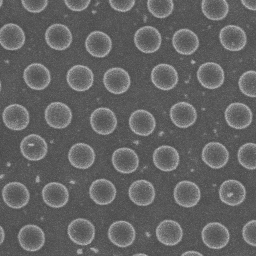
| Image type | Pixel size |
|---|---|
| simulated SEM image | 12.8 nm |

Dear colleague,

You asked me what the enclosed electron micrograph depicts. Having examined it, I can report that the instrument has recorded a regular array of raised bodies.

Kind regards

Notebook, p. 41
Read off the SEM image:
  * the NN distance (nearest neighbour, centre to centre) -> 518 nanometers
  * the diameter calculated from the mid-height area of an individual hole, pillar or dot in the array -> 327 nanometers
